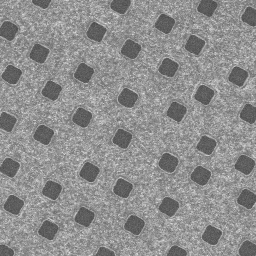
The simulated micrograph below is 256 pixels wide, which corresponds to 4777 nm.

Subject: a regular array of holes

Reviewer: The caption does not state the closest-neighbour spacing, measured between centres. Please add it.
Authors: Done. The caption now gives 715 nanometers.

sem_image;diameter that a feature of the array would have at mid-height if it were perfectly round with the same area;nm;359